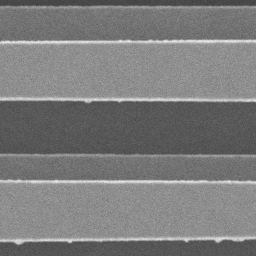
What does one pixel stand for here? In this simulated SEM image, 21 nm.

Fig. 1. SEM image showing lines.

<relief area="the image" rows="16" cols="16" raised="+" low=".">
++++++++++++++++
++++++++++++++++
++++++++++++++++
++++++++++++++++
++++++++++++++++
++++++++++++++++
................
................
................
................
++++++++++++++++
++++++++++++++++
++++++++++++++++
++++++++++++++++
++++++++++++++++
................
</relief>